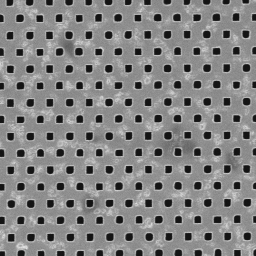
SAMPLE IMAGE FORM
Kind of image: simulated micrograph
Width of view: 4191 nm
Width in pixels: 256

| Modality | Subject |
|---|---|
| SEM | a regular array of holes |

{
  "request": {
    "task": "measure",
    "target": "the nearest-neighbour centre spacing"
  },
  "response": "313 nm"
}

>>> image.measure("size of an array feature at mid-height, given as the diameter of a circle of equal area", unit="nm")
133